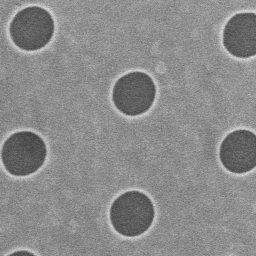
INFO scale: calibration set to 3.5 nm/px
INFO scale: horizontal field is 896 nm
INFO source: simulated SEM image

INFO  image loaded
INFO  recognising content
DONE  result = holes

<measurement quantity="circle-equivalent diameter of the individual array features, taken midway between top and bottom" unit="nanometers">158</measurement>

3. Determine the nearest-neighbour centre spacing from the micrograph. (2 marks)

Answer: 422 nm